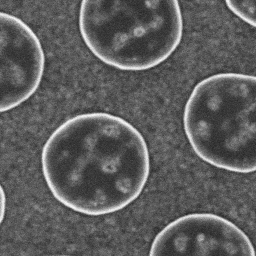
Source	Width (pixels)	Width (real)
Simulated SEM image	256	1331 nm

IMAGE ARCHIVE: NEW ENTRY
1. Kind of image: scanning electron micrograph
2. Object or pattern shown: raised bodies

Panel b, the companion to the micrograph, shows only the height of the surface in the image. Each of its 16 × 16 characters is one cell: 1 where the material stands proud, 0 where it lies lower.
0000011111100001
1000011111100000
1100011111100000
1110001111000000
1110000000000000
1100000000001111
1000000000001111
0000011000001111
0001111110001111
0001111110001111
0001111110000011
0001111110000000
0000111100000000
0000000000001000
0000000000111110
0000000000111111